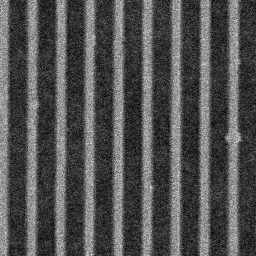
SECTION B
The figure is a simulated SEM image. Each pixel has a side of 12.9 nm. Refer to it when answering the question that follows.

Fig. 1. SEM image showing parallel lines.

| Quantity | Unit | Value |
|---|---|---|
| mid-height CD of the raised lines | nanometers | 134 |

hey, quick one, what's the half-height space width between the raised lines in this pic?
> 0.243 microns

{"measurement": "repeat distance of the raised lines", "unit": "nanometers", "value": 372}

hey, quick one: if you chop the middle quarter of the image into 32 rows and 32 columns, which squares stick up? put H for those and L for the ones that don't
HLLLLHHHLLLLLHHLLLLLHHLLLLLHHLLL
HLLLLHHHLLLLLHHLLLLLHHLLLLLHHLLL
LLLLLHHHLLLLLHHLLLLLHHLLLLLHHLLL
LLLLLHHHLLLLLHHLLLLLHHLLLLLHHLLL
LLLLLHHHLLLLLHHLLLLLHHLLLLLHHLLL
LLLLLHHLLLLLLHHLLLLLHHLLLLLHHLLL
LLLLLHHLLLLLLHHLLLLLHHLLLLLHHLLL
HLLLLHHLLLLLLHHLLLLLHHLLLLLHHLLL
LLLLLHHLLLLLLHHLLLLLHHLLLLLHHLLL
LLLLLHHLLLLLLHHLLLLLHHLLLLLHHLLL
LLLLLHHLLLLLLHHLLLLLHHLLLLLHHLLL
LLLLLHHLLLLLLHHLLLLLHHLLLLLHHLLL
LLLLLHHHLLLLLHHLLLLLHHLLLLLHHLLL
LLLLLHHHLLLLLHHLLLLLHHLLLLLHHLLL
LLLLLHHHLLLLLHHLLLLLHHLLLLLHHLLL
HLLLLHHHLLLLLHHLLLLLHHLLLLLHHLLL
LLLLLHHHLLLLLHHLLLLLHHLLLLLHHLLL
LLLLLHHHLLLLLHHLLLLLHHLLLLLHHLLL
LLLLLHHHLLLLLHHLLLLLHHLLLLLHHLLL
LLLLLHHHLLLLLHHLLLLLHHLLLLLHHLLL
LLLLLHHHLLLLLHHLLLLLHHLLLLLHHLLL
LLLLLHHHLLLLLHHLLLLLHHLLLLLHHLLL
LLLLLHHHLLLLHHHLLLLLHHLLLLLHHLLL
LLLLLHHHLLLLHHHLLLLLHHLLLLLHHLLL
LLLLLHHHLLLLHHHLLLLLHHLLLLLHHLLL
LLLLLHHHLLLLHHHLLLLLHHLLLLLHHLLL
LLLLLHHHLLLLHHHLLLLLHHLLLLLHHLLL
LLLLLHHHLLLLHHHLLLLLHHLLLLLHHLLL
LLLLLHHHLLLLHHHLLLLLHHLLLLLHHLLL
LLLLLHHHLLLLHHHLLLLLHHLLLLLHHLLL
LLLLLHHHLLLLHHHLLLLLHHLLLLLHHLLL
LLLLLHHHLLLLHHHLLLLLHHLLLLLHHLLL